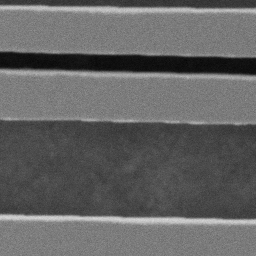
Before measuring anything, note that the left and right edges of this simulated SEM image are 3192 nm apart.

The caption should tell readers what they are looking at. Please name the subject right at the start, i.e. lines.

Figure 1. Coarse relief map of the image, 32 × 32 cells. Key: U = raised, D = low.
DDDDDDDDDDDDDDDDDDDDDDDDDDDDDDDD
UUUUUUUUUUUUUUUUUUUUUUUUUUUUUUUU
UUUUUUUUUUUUUUUUUUUUUUUUUUUUUUUU
UUUUUUUUUUUUUUUUUUUUUUUUUUUUUUUU
UUUUUUUUUUUUUUUUUUUUUUUUUUUUUUUU
UUUUUUUUUUUUUUUUUUUUUUUUUUUUUUUU
DDUUUUUUUUUUUUUUUUUUUUUUUUUUUUUU
DDDDDDDDDDDDDDDDDDDDDDDDDDDDDDDD
DDDDDDDDDDDDDDDDDDDDDDDDDDDDDDDD
UUUUUUUUUUUUUUUUUUUUUUUUUUUUUUUU
UUUUUUUUUUUUUUUUUUUUUUUUUUUUUUUU
UUUUUUUUUUUUUUUUUUUUUUUUUUUUUUUU
UUUUUUUUUUUUUUUUUUUUUUUUUUUUUUUU
UUUUUUUUUUUUUUUUUUUUUUUUUUUUUUUU
UUUUUUUUUUUUUUUUUUUUUUUUUUUUUUUU
DDDDDDDDDDDDDDDDDDDDDDDDDDDDDUDD
DDDDDDDDDDDDDDDDDDDDDDDDDDDDDDDD
DDDDDDDDDDDDDDDDDDDDDDDDDDDDDDDD
DDDDDDDDDDDDDDDDDDDDDDDDDDDDDDDD
DDDDDDDDDDDDDDDDDDDDDDDDDDDDDDDD
DDDDDDDDDDDDDDDDDDDDDDDDDDDDDDDD
DDDDDDDDDDDDDDDDDDDDDDDDDDDDDDDD
DDDDDDDDDDDDDDDDDDDDDDDDDDDDDDDD
DDDDDDDDDDDDDDDDDDDDDDDDDDDDDDDD
DDDDDDDDDDDDDDDDDDDDDDDDDDDDDDDD
DDDDDDDDDDDDDDDDDDDDDDDDDDDDDDDD
DDDDDDDDDDDDDDDDDDDDDDDDDDDDDDDD
UUUUUUUUUUUUUUUUUUUUUUUUUDDDDDDD
UUUUUUUUUUUUUUUUUUUUUUUUUUUUUUUU
UUUUUUUUUUUUUUUUUUUUUUUUUUUUUUUU
UUUUUUUUUUUUUUUUUUUUUUUUUUUUUUUU
UUUUUUUUUUUUUUUUUUUUUUUUUUUUUUUU